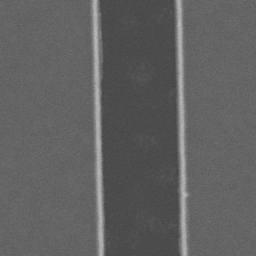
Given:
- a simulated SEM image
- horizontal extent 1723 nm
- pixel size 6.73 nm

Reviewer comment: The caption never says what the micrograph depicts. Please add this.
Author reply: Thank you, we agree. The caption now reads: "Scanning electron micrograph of one or a few lines or trenches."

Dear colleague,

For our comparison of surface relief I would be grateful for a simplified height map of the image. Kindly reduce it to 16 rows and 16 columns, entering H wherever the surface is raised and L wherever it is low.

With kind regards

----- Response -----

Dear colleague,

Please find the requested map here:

HHHHHHLLLLLHHHHH
HHHHHHLLLLLHHHHH
HHHHHHLLLLLHHHHH
HHHHHHLLLLLHHHHH
HHHHHHLLLLLHHHHH
HHHHHHLLLLLHHHHH
HHHHHHLLLLLHHHHH
HHHHHHLLLLLHHHHH
HHHHHHLLLLLHHHHH
HHHHHHLLLLLHHHHH
HHHHHHLLLLLHHHHH
HHHHHHLLLLLHHHHH
HHHHHHLLLLLHHHHH
HHHHHHLLLLLHHHHH
HHHHHHLLLLLHHHHH
HHHHHHLLLLLLHHHH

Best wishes